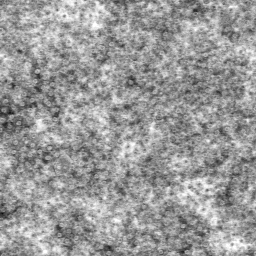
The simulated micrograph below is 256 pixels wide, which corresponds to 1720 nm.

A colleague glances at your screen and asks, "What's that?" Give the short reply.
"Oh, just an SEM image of a regular array of raised bodies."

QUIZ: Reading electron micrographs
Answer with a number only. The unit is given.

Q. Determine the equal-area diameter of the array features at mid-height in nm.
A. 27.4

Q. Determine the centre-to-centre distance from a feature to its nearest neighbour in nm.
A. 63.1